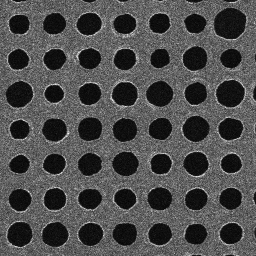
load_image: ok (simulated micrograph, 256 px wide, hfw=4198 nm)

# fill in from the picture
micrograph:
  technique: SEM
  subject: a regular array of holes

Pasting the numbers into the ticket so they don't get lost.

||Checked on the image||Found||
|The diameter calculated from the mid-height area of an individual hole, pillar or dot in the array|367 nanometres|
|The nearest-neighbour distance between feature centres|0.569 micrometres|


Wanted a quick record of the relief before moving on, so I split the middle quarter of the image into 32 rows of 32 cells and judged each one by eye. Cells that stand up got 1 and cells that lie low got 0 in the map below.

11110000111110000111110001111100
11111111111111101111111111111110
11111111111111111111111111111111
11111111111111111111111111111111
11111111111111111111111001111111
11110000011110000011110000111110
11110000011100000011100000011100
11110000011100000001000000011100
11110000011100000011100000011100
11110000111110000011100000011110
11111111111111101111111001111111
11111111111111111111111111111111
11111111111111111111111111111111
11111000111111111111111101111110
11110000011110000011110000111100
01110000001100000011100000011100
01100000001100000011100000011000
01110000011100000011100000011100
11110000011110000011110000111110
11111111111111011111111111111111
11111111111111111111111111111111
11111111111111111111111111111111
11111000111111000111111101111110
11110000011100000011110000111100
11110000011100000001110000011100
11100000011100000001110000011100
11110000011100000011110000111100
11111000111110000111111111111111
11111111111111111111111111111111
11111111111111111111111111111111
11111111111111111111111111111111
11111000111111000111110000111111